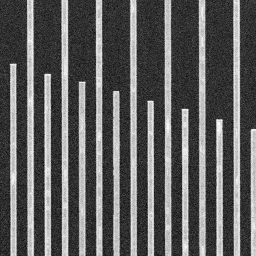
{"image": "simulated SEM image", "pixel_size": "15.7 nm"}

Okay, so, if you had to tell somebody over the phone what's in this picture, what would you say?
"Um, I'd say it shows parallel lines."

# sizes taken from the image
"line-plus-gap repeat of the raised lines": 270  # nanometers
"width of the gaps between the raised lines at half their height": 184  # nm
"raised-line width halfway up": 80.3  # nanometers